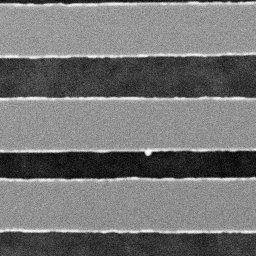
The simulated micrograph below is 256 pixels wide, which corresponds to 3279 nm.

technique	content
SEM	lines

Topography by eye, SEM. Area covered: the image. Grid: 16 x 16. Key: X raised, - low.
XXXXXXXXXXXXXXXX
XXXXXXXXXXXXXXXX
XXXXXXXXXXXXXXXX
XXXXXXXXXXXX----
----------------
----------------
XXXXXXXXXXXXXXXX
XXXXXXXXXXXXXXXX
XXXXXXXXXXXXXXXX
---------X------
----------------
XXXXXXXXXXXXXXXX
XXXXXXXXXXXXXXXX
XXXXXXXXXXXXXXXX
------XXX-XXXXXX
----------------